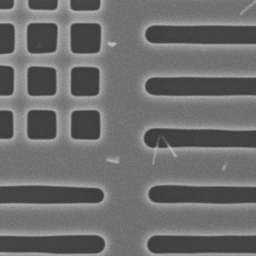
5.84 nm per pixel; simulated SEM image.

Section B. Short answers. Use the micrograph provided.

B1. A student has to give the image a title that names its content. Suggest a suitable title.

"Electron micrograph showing groups of lines, slits or small figures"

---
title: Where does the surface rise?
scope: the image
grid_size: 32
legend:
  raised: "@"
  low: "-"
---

--@@---@@----@@@@@@@@@@@@@@@@@@@
@@@@@@@@@@@@@@@@@@@@@@@@@@@@@@@@
@@@@@@@@@@@@@@@@@@@@@@@@@@@@@@@@
--@----@@----@@@@@@-------------
--@----@@----@@@@@--------------
--@----@@----@@@@@@@@@@@@-------
-@@@---@@---@@@@@@@@@@@@@@@@@@@@
@@@@@@@@@@@@@@@@@@@@@@@@@@@@@@@@
-@@@---@@---@@@@@@@@@@@@@@@@@@@@
--@----@@---@@@@@@@@@@@@@@@@@@@@
--@----@@---@@@@@@--------------
--@----@@---@@@@@@@-------------
@@@@@@@@@@@@@@@@@@@@@@@@@@@@@@@@
@@@@@@@@@@@@@@@@@@@@@@@@@@@@@@@@
--@----@@---@@@@@@@@@@@@@@@@@@@@
--@----@@----@@@@@@@@@@@@@@@@@@@
--@----@@----@@@@@--------------
@@@@@@@@@@@@@@@@@@--------------
@@@@@@@@@@@@@@@@@@@@@@@@@@@@@@@@
@@@@@@@@@@@@@@@@@@@@@@@@@@@@@@@@
@@@@@@@@@@@@@@@@@@@@@@@@@@@@@@@@
@@@@@@@@@@@@@@@@@@@@@@@@@@@@@@@@
@@@@@@@@@@@@@@@@@@@@@@@@@@@@@@@@
------------@@@@@@@-------------
-------------@@@@@@-------------
@@@@@@@@@@@@@@@@@@@@@@@@@@@@@@@@
@@@@@@@@@@@@@@@@@@@@@@@@@@@@@@@@
@@@@@@@@@@@@@@@@@@@@@@@@@@@@@@@@
@@@@@@@@@@@@@@@@@@@@@@@@@@@@@@@@
------------@@@@@@@-------------
-------------@@@@@--------------
------------@@@@@@@-------------